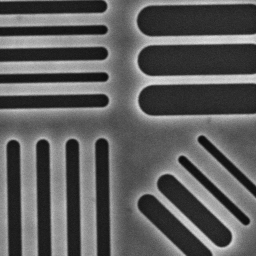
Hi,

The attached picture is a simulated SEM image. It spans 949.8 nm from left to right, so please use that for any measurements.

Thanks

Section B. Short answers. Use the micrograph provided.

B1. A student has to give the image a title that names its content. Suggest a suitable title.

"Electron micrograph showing groups of lines, slits or small figures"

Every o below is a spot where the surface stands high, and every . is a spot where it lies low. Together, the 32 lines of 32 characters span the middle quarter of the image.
ooooooooooooooooooo.............
ooooooooooooooooooo.............
...........ooooooooo............
...........ooooooooooooooooooooo
..........oooooooooooooooooooooo
ooooooooooooooooooooo...........
ooooooooooooooooooo.............
oooooooo.oooooooooo.............
...........oooooooo.............
...........oooooooo.............
...........oooooooo.............
ooooooooooooooooooo.............
oooooooooooooooooooo............
oooooooooooooooooooooooooooooooo
oooooooooooooooooooooooooooooooo
oooooooooooooooooooooooooooooooo
oooooooooooooooooooooooooooooooo
oooooooooooooooooooooooooooooooo
ooooooooo.oooooooooooooooooooooo
o...oooo...ooooooooooooooooooooo
....oooo...ooooooooooooooooooooo
....oooo...ooooooooooooooooooooo
....oooo...ooooooooooooooooooooo
....oooo...oooooooooooooooooo..o
....oooo...oooooooooooooooooo...
....oooo...ooooooooooooooooooo..
....oooo...oooooooooooooooooooo.
....oooo...oooooooooooooo..ooooo
....oooo...ooooooooooooo....oooo
....oooo...oooooooooooo......ooo
....oooo....ooooooooooo.......oo
....oooo....oooooooooooo.......o